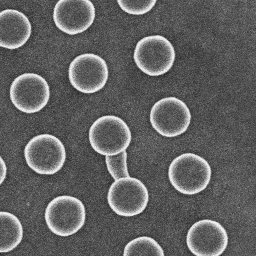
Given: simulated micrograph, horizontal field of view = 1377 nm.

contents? raised bodies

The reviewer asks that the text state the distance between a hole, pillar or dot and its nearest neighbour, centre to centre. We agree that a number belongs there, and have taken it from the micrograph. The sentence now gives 332 nanometres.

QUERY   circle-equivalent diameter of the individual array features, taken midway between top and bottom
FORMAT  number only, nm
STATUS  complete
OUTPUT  209